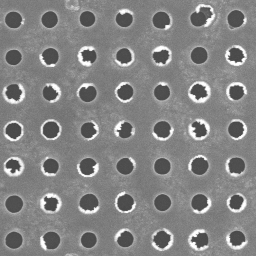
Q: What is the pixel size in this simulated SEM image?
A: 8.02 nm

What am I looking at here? a regular array of holes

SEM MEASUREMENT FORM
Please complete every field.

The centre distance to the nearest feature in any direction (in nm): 290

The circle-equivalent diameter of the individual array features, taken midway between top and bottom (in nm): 130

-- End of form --